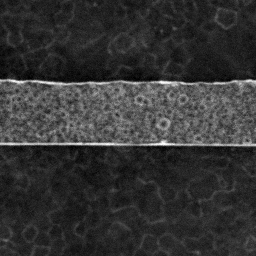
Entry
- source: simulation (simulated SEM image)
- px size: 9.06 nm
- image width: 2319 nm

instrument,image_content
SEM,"one or a few lines or trenches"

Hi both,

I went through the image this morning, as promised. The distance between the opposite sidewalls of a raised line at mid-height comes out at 567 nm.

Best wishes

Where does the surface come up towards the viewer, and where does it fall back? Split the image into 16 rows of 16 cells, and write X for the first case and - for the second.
----------------
----------------
----------------
----------------
----------------
XXXXXXXXXXXXXXXX
XXXXXXXXXXXXXXXX
XXXXXXXXXXXXXXXX
XXXXXXXXXXXXXXXX
----------------
----------------
----------------
----------------
----------------
----------------
----------------